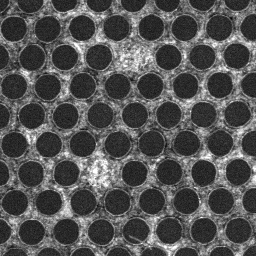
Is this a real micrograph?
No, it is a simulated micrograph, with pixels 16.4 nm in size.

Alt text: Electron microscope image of a regular array of raised bodies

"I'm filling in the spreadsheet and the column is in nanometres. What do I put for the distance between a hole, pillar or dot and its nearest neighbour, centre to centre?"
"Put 545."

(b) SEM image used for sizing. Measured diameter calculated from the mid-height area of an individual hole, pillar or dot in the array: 448 nm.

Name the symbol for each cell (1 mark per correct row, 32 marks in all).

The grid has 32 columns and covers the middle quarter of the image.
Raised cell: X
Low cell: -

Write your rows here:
XXX---XXXXX------------XXXXXX---
XX------X--------X-------XX-----
---XXX------XXX-----XXX------XXX
--XXXXX----XXXXX---XXXXX----XXXX
--XXXXXX--XXXXXXX-XXXXXXX--XXXXX
-XXXXXXX--XXXXXXX-XXXXXXX--XXXXX
-XXXXXXX--XXXXXXX--XXXXXX--XXXXX
--XXXXX----XXXXX---XXXXX----XXXX
---XXX------XXX-----XXX------XXX
-------------------------XX-----
XXX----XXXX----XXXXX----XXXXX---
XXX---XXXXXX---XXXXXX--XXXXXX---
XXXX--XXXXXX--XXXXXXX--XXXXXX---
XXXX--XXXXXX--XXXXXXX--XXXXXX---
XXX---XXXXXX---XXXXXX--XXXXXX---
XXX----XXXX-----XXXX----XXXX----
----------------------X---------
---XXXX----XXXXX----XXXX----XXXX
--XXXXXX---XXXXX---XXXXXX---XXXX
-XXXXXXX--XXXXXXX--XXXXXX--XXXXX
--XXXXXX--XXXXXXX--XXXXXX--XXXXX
--XXXXXX--XXXXXX---XXXXXX--XXXXX
--XXXXX----XXXXX----XXXX----XXXX
--------------------------------
XXX-------------XXX-----XXXX----
XXXX-----------XXXXXX--XXXXXX---
XXXX-----------XXXXXX--XXXXXXX--
XXXX----------XXXXXXX--XXXXXXX--
XXXX----------XXXXXXX--XXXXXX---
XXX------------XXXXX----XXXXX---
----------------XXX-------------
----XX------XXX-----XXXX-----XXX